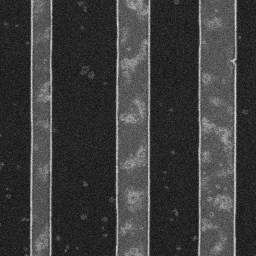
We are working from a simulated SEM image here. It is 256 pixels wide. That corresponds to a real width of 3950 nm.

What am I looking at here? one or a few lines or trenches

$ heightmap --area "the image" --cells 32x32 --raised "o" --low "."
oooo..ooooooooo....oooooo.....oo
oooo..ooooooooo....oooooo.....oo
oooo..ooooooooo....oooooo.....oo
oooo..ooooooooo....oooooo.....oo
oooo..ooooooooo....oooooo.....oo
oooo..ooooooooo....oooooo.....oo
oooo..ooooooooo....oooooo....ooo
oooo..ooooooooo....oooooo....ooo
oooo..ooooooooo....oooooo....ooo
oooo..ooooooooo....oooooo....ooo
oooo..ooooooooo....oooooo....ooo
oooo..ooooooooo....oooooo....ooo
oooo..ooooooooo....oooooo....ooo
oooo..ooooooooo....oooooo....ooo
oooo..ooooooooo....oooooo....ooo
oooo..ooooooooo....oooooo....ooo
oooo..ooooooooo....oooooo....ooo
oooo..ooooooooo....oooooo....ooo
oooo..ooooooooo....oooooo....ooo
oooo..ooooooooo....oooooo....ooo
oooo..ooooooooo....oooooo....ooo
oooo..ooooooooo....oooooo....ooo
oooo..ooooooooo....oooooo....ooo
oooo..ooooooooo....oooooo....ooo
oooo..ooooooooo....oooooo....ooo
oooo..ooooooooo....oooooo....ooo
oooo..ooooooooo....oooooo....ooo
oooo..ooooooooo....oooooo....ooo
oooo..ooooooooo....oooooo....ooo
oooo..ooooooooo....oooooo....ooo
oooo..ooooooooo....oooooo....ooo
oooo..ooooooooo....oooooo....ooo